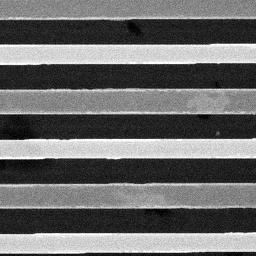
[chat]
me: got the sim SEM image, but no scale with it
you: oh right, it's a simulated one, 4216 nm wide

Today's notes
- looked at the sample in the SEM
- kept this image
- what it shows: lines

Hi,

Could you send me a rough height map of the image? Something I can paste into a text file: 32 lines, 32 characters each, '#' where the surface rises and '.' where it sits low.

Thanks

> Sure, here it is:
################################
################################
................................
................................
................................
................................
################################
################################
................................
................................
................................
################################
################################
################################
................................
................................
................................
...####.########################
################################
################################
................................
................................
................................
################################
################################
################################
................................
................................
................................
################################
################################
###########.....................